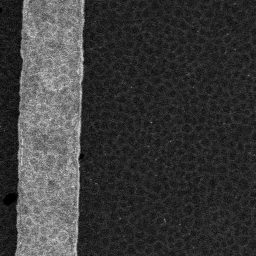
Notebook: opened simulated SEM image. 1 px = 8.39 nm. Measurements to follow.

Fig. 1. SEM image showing one or a few lines or trenches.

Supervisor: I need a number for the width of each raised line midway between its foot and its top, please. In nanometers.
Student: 500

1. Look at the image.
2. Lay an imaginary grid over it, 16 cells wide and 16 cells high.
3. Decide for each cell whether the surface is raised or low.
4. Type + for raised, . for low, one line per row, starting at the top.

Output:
.++++...........
.++++...........
.++++...........
.++++...........
.++++...........
.++++...........
.++++...........
.++++...........
.++++...........
.++++...........
.++++...........
.++++...........
.++++...........
.++++...........
.++++...........
.++++...........